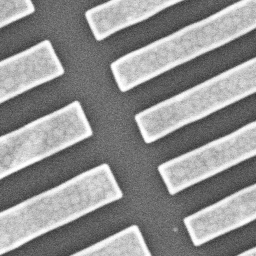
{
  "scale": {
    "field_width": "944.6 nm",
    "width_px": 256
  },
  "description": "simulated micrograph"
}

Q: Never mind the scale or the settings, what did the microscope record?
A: groups of lines, slits or small figures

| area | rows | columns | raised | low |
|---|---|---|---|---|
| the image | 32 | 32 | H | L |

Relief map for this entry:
HHHHLLLLLLLLLHHHHHHHHLLLLLLLLLHH
HHHHLLLLLLLHHHHHHHHLLLLLLLLLHHHH
HHLLLLLLLLLHHHHHHLLLLLLLLLHHHHHH
LLLLLLLLLLLLHHHLLLLLLLLHHHHHHHHL
LLLLLLLLLLLLHLLLLLLLLLHHHHHHHHLL
LLLLLHLLLLLLLLLLLLLHHHHHHHHHLLLL
LLLHHHHLLLLLLLLLLHHHHHHHHLLLLLLL
LHHHHHHLLLLLLLLHHHHHHHHLLLLLLLLL
HHHHHHHHLLLLLLHHHHHHHLLLLLLLLLHH
HHHHHHHLLLLLLLLHHHHLLLLLLLLLHHHH
HHHHLLLLLLLLLLLHHLLLLLLLLHHHHHHH
HHLLLLLLLLLLLLLLLLLLLLLLHHHHHHHL
LLLLLLLLLLLLLLLLLLLLLHHHHHHHHLLL
LLLLLLLLHHLLLLLLLLLHHHHHHHHLLLLL
LLLLLLHHHHLLLLLLLHHHHHHHHLLLLLLL
LLLLHHHHHHHLLLLLLHHHHHHLLLLLLLLL
LLHHHHHHHHHLLLLLLLHHHLLLLLLLLLHH
HHHHHHHHHHLLLLLLLLLLLLLLLLLLHHHH
HHHHHHHHLLLLLLLLLLLLLLLLLHHHHHHH
HHHHHHLLLLLLLLLLLLLLLLLHHHHHHHHL
HHHLLLLLLLLLLLLLLLLLLHHHHHHHHLLL
HLLLLLLLLLLHHHLLLLLLHHHHHHHLLLLL
LLLLLLLLLHHHHHLLLLLLLHHHHLLLLLLL
LLLLLLLHHHHHHHHLLLLLLHHLLLLLLLLH
LLLLLHHHHHHHHHHLLLLLLLLLLLLLLHHH
LLLHHHHHHHHHHLLLLLLLLLLLLLLHHHHH
LHHHHHHHHHHLLLLLLLLLLLLLLHHHHHHH
HHHHHHHHHLLLLLLLLLLLLLLLHHHHHHHL
HHHHHHLLLLLLLLLLLLLLLLLLHHHHHLLL
HHHHLLLLLLLLLLLHHLLLLLLLHHHLLLLL
HHLLLLLLLLLLHHHHHHLLLLLLLLLLLLLL
LLLLLLLLLLHHHHHHHHLLLLLLLLLLLLLH